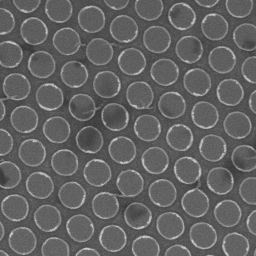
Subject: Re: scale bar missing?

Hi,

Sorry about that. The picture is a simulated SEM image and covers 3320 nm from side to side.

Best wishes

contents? a regular array of raised bodies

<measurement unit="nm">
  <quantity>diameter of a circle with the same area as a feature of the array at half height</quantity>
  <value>348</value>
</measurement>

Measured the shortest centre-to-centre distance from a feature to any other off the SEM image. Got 434 nanometres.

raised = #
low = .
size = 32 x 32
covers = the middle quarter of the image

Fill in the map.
#####.........######..######....
######........######..#######...
######..#####...##....#######.##
######..######........######..##
#####...######....#....#####..##
.###...#######..#####.........##
........######..######.........#
....#...#####...######...####...
..#####.........######..######..
.#######........######..######..
.#######...###...#####..######..
.#######..######........######..
..######.#######.........#####..
...####..#######..#####....#....
#.........######..######........
#.........######..######...###..
#...####....##....######..######
#..######.........######..######
#..#######...###...####...######
...#######..#####.........######
....#####..#######.........#####
#...#####..#######...####...##..
###........#######..######......
###.........#####...######...###
###...####...###...#######..####
###..######.........######..####
###..#######....#....####...####
##...#######..#####.........####
.....######..#######........####
......#####..#######..#####..###
####.........#######..#####.....
#####.........######.#######....